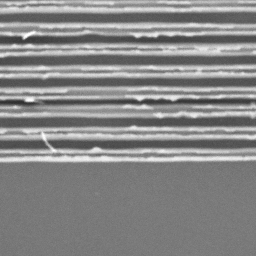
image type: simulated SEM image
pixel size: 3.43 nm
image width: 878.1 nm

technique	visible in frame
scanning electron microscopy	parallel lines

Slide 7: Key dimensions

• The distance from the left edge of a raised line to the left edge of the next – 0.0724 micrometres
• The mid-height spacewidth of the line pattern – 38.5 nm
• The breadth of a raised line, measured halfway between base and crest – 35.5 nanometres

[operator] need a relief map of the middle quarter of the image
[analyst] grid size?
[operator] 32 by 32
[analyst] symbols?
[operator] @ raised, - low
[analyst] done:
--------------------------------
@@@@@@@@@@@@@@@@@@@@@@@@@@@@@@@@
@@@@@@@@@@@@@@@@@@@@@@@@@@@@@@@@
--------------------------------
--------------------------------
--------------------------------
@@@@@@@@@@@@@@@@@@@@@@@@@@@@@@@@
@@@@@@@@@@@@@@@@@@@@@@@@@@@@@@@@
@@@@@@@-@@-@-----@@@@@@@@@@@@---
--------------------------------
---------------@@--@@--@@@@@@@@@
@@@@@@@@@@@@@@@@@@@@@@@@@@@@@@@@
@@@@@@@@@@@@@@@@@@@@@@@@@@@@@@@@
--------------------------------
--------------------------------
--------------------------------
@@@@@@@@@@@@@@@@@@@@@@@@@@@@@@@@
@@@@@@@@@@@@@@@@@@@@@@@@@@@@@@@@
---@@@--@@@@@@@@@@@@@-----------
--------------------------------
--------------------------------
-------@@@----------------------
@@@@@@@@@@@@@@@@@@@@@@@@@@@@@@@@
@@@@@@@@@@@@@@@@@@@@@@@@@@@@@@@@
--------------------------------
--------------------------------
--------------------------------
--------------------------------
--------------------------------
--------------------------------
--------------------------------
--------------------------------